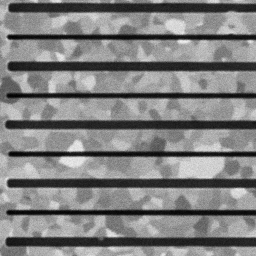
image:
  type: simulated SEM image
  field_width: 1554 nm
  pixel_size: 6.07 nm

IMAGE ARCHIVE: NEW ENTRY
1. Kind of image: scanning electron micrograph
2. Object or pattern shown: parallel lines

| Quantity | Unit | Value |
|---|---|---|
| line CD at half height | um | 0.131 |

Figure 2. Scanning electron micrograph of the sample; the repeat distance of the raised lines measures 176 nanometers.